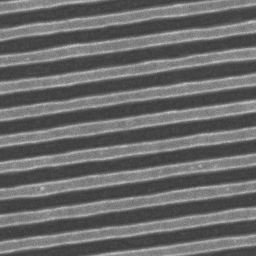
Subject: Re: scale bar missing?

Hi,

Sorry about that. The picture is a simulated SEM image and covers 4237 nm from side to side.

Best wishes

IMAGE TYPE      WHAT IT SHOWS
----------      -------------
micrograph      parallel lines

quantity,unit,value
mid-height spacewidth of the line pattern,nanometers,234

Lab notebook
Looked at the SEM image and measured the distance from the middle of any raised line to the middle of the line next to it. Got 26.4 pixels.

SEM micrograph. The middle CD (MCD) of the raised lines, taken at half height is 12.3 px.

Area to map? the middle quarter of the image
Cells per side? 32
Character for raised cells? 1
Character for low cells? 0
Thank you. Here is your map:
00000000000000011111111111111111
00000000111111111111111111100000
11111111111111111111110000000000
11111111111110000000000000000000
11111100000000000000000000000001
10000000000000000000000001111111
00000000000000000011111111111111
00000000000111111111111111111111
00001111111111111111111110000000
11111111111111110000000000000000
11111111110000000000000000000000
11100000000000000000000000000011
00000000000000000000000111111111
00000000000000011111111111111111
00000001111111111111111111111100
11111111111111111111110000000000
11111111111111100000000000000000
11111111100000000000000000000000
10000000000000000000000000001111
00000000000000000000111111111111
00000000000001111111111111111111
00001111111111111111111111100000
11111111111111111111110000000000
11111111111111000000000000000000
11111100000000000000000000000000
00000000000000000000000001111111
00000000000000000011111111111111
00000000000111111111111111111111
00011111111111111111111110000000
11111111111111111100000000000000
11111111111100000000000000000000
11100000000000000000000000001111